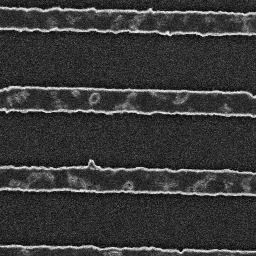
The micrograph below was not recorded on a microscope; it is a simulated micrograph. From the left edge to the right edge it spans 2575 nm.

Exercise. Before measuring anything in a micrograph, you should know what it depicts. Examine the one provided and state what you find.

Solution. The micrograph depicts one or a few lines or trenches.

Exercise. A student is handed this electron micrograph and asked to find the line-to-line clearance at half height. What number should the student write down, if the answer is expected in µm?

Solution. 0.568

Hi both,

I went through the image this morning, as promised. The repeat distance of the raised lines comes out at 0.8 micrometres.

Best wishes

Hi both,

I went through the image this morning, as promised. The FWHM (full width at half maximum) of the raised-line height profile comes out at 225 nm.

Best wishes